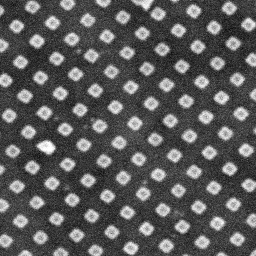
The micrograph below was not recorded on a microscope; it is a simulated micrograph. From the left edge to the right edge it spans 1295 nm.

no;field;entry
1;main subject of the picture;a regular array of raised bodies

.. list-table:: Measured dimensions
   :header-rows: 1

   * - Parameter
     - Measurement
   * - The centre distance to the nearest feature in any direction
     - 124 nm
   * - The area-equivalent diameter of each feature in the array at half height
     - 55.9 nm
